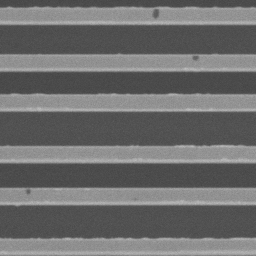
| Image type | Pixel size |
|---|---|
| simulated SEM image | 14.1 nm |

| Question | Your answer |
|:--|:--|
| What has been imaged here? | lines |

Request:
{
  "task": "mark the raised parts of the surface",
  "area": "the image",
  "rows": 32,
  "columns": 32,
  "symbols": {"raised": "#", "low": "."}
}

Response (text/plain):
................................
################################
################################
................................
................................
................................
................................
################################
################################
................................
................................
................................
################################
################################
................................
................................
................................
................................
################################
################################
................................
................................
................................
................................
################################
################################
................................
................................
................................
................................
################################
################################